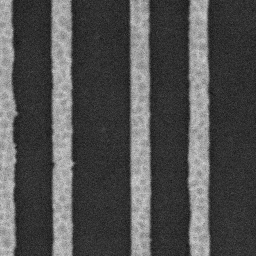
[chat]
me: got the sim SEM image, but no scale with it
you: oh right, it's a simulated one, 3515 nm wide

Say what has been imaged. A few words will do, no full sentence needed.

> one or a few lines or trenches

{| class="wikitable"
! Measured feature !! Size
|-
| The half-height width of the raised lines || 253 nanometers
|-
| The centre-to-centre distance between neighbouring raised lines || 0.939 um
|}